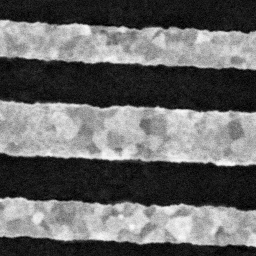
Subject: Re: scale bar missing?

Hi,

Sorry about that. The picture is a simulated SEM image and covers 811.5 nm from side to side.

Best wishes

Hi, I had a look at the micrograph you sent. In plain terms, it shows lines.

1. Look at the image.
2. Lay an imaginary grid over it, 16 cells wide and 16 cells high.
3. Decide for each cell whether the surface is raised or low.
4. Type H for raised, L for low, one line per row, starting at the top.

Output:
LLLLLLLLLLLLLLLL
HHHLLLLLLLLLLLLL
HHHHHHHHHHHHHHHH
HHHHHHHHHHHHHHHH
LLLLLLLLLLLLLLLL
LLLLLLLLLLLLLLLL
HHLHLLLLLLLLLLLL
HHHHHHHHHHHHHHHH
HHHHHHHHHHHHHHHH
HHHHHHHHHHHHHHHH
LLLLLLLLLLLLLLLL
LLLLLLLLLLLLLLLL
HHLLLLLLLLLLLLLL
HHHHHHHHHHHHHHHH
HHHHHHHHHHHHHHHH
LLLLLLLLLLLLLLLL